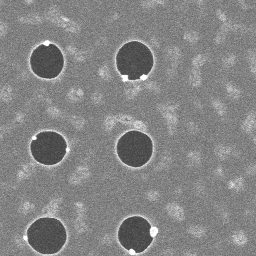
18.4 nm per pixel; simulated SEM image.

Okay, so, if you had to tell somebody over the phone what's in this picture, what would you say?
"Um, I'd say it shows holes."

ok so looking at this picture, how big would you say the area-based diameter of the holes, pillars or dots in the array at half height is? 659 nm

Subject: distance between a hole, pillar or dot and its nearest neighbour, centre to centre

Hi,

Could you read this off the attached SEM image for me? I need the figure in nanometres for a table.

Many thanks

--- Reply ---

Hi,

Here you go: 1590